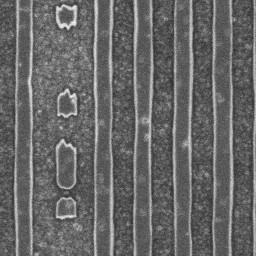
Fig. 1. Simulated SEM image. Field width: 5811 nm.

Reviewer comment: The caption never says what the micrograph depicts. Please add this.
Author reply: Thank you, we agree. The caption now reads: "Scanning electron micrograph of parallel lines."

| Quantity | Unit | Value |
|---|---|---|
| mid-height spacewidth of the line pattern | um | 0.53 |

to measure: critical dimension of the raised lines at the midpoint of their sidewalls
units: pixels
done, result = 16.9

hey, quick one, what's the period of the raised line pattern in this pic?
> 39.9 px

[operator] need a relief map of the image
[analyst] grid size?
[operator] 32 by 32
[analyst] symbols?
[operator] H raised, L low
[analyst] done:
LLHHLLLLLLLLHHLLLHHLLLHHLLLHHLLL
LLHHLLLHHLLLHHLLLHHLLLHHLLLHHLLL
LLHHLLLHHLLLHHLLLHHLLLHHLLLHHLLL
LLHHLLLLLLLLHHLLLHHLLLHHLLLHHLLL
LLHHLLLLLLLLHHLLLHHLLLHHLLLHHLLL
LLHHLLLLLLLLHHLLLHHLLLHHLLLHHLLL
LLHHLLLLLLLLHHLLLHHLLLHHLLLHHLLL
LLHHLLLLLLLLHHLLLHHLLLHHLLLHHLLL
LLHHLLLLLLLLHHLLLHHLLLHHLLLHHLLL
LLHHLLLLLLLLHHLLLHHLLLHHLLLHHLLL
LLHHLLLLLLLLHHLLLHHLLLHHLLLHHLLL
LLHHLLLLHLLLHHLLLHHLLLHHLLLHHLLL
LLHHLLLHHLLLHHLLLHHLLLHHLLLHHLLL
LLHHLLLHHLLLHHLLLHHLLLHHLLLHHLLL
LLHHLLLLHLLLHHLLLHHLLLHHLLLHHLLL
LLHHLLLLLLLLHHLLLHHLLLHHLLLHHLLL
LLHHLLLLLLLLHHLLLHHLLLHHLLLHHLLL
LLHHLLLLLLLLHHLLLHHLLLHHLLLHHLLL
LLHHLLLHHLLLHHLLLHHLLLHHLLLHHLLL
LLHHLLLHHLLLHHLLLHHLLLHHLLLHHLLL
LLHHLLLHHLLLHHLLLHHLLLHHLLLHHLLL
LLHHLLLHHLLLHHLLLHHLLLHHLLLHHLLL
LLHHLLLHHLLLHHLLLHHLLLHHLLLHHLLL
LLHHLLLLHLLLHHLLLHHLLLHHLLLHHLLL
LLHHLLLLLLLLHHLLLHHLLLHHLLLHHLLL
LLHHLLLHHLLLHHLLLHHLLLHHLLLHHLLL
LLHHLLLHHLLLHHLLLHHLLLHHLLLHHLLL
LLHHLLLLLLLLHHLLLHHLLLHHLLLHHLLL
LLHHLLLLLLLLHHLLLHHLLLHHLLLHHLLL
LLHHLLLLLLLLHHLLLHHLLLHHLLLHHLLL
LLHHLLLLLLLLHHLLLHHLLLHHLLLHHLLL
LLHHLLLLLLLLHHLLLHHLLLHHLLLHHLLL